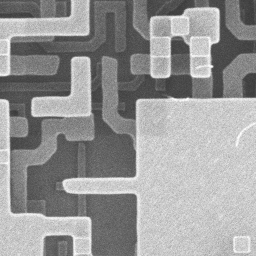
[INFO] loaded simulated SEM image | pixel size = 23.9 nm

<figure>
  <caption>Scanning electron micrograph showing wiring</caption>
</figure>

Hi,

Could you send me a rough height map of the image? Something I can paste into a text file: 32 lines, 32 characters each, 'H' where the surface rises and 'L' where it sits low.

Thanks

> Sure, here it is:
LLLLLHHLLHHLLLLLLHLLLLLLHHLLHHLL
LLLLLHHLLHHLLLLLLHLLLLLHHHHLHHLL
HHHHHHHHHHHLLLLLLHHHHHHHHHHLHHLL
HHHHHHHHHHHLLLLLLHHHHHHHHHHLHHHH
HHHHHHHLLLLLLLLLLLHHHHHHHHHLLHHH
HHLLLLLLLLLLLLLLLLLHHLLHHHHLLLLL
HLLLLLLLLLLLLLLLLLLHHLLLHHLLLLLL
HHHHHHHLLHHLLHLLHHHHHHHHHHLLLHHH
HHHHHHHLLHHLLHHLHHHHHHHHHHLLHHHH
LLLLLLLLLHHLLHHLLLLHHLLLHHHLHHHL
LLLLLLLLLHHLLHHLLLLLLLLLHHHLHHLL
LLLLLLLLLHHLLHHLLLLLLLLLHHHLHHLL
LLLLHHHHHHHLLHHLLHHHHHHHHHHHHHHH
HLLLHHHHHHHLLHHLLHHHHHHHHHHHHHHH
HLLLHHHHHHHHLHHLLHHHHHHHHHHHHHHH
HHHLLHHHHHHHLHHHHHHHHHHHHHHHHHHH
HHHLLHHHHHHHLLHHHHHHHHHHHHHHHHHH
HLLLLHHLLHHLLLLLLHHHHHHHHHHHHHHH
HLLLLHHLLLLLLLLLLHHHHHHHHHHHHHHH
HHHHHHLLLLLLLLLLLHHHHHHHHHHHHHHH
HHHHHLLLLLLLLLLLLHHHHHHHHHHHHHHH
HHHLLLLLLLLLLLLLLHHHHHHHHHHHHHHH
HHHLLLLLHHHHHHHHHHHHHHHHHHHHHHHH
HHHLLLLLHHHHHHHHHHHHHHHHHHHHHHHH
HHHLLLLLLLLLLLLLLHHHHHHHHHHHHHHH
HHHLLLLLLLLLLLLLLHHHHHHHHHHHHHHH
HHHHLLLLLLLLLLLLLHHHHHHHHHHHHHHH
HHHHHHHHHHHLLLLLLHHHHHHHHHHHHHHH
HHHHHHHHHHHLLLLLLHHHHHHHHHHHHHHH
HHHHHHLLLHHLLLLLLHHHHHHHHHHHHHHH
HHHHHLLLLHHLLLLLLHHHHHHHHHHHHHHH
HHHHHLLLLHHLLLLLLHHHHHHHHHHHHHHH